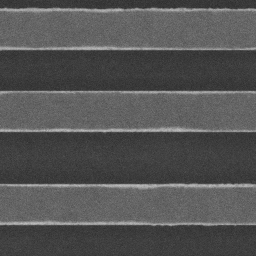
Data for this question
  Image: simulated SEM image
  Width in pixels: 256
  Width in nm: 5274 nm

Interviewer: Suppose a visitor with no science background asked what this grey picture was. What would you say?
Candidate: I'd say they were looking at lines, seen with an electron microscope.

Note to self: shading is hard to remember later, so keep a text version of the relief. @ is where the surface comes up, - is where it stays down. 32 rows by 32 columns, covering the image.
--------------------------------
@@@@@@@@@@@@@@@@@@@@@@@@@@@@@@@@
@@@@@@@@@@@@@@@@@@@@@@@@@@@@@@@@
@@@@@@@@@@@@@@@@@@@@@@@@@@@@@@@@
@@@@@@@@@@@@@@@@@@@@@@@@@@@@@@@@
@@@@@@@@@@@@@@@@@@@@@@@@@@@@@@@@
--------------------------------
--------------------------------
--------------------------------
--------------------------------
--------------------------------
@@@@@@@@@@@@@@@@@@@@@@@@@@@@@@@@
@@@@@@@@@@@@@@@@@@@@@@@@@@@@@@@@
@@@@@@@@@@@@@@@@@@@@@@@@@@@@@@@@
@@@@@@@@@@@@@@@@@@@@@@@@@@@@@@@@
@@@@@@@@@@@@@@@@@@@@@@@@@@@@@@@@
--------------------------------
--------------------------------
--------------------------------
--------------------------------
--------------------------------
--------------------------------
--------------------------------
@@@@@@@@@@@@@@@@@@@@@@@@@@@@@@@@
@@@@@@@@@@@@@@@@@@@@@@@@@@@@@@@@
@@@@@@@@@@@@@@@@@@@@@@@@@@@@@@@@
@@@@@@@@@@@@@@@@@@@@@@@@@@@@@@@@
@@@@@@@@@@@@@@@@@@@@@@@@@@@@@@@@
--------------------------------
--------------------------------
--------------------------------
--------------------------------